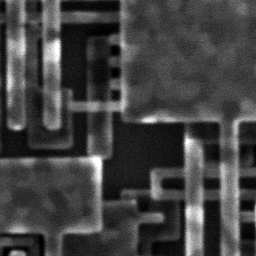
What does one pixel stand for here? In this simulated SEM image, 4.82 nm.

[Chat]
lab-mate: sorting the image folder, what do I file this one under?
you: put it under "wiring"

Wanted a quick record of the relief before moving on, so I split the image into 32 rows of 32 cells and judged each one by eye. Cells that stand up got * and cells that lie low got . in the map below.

.**..**........*****************
.**..**........*****************
.**..**........*****************
.**..**........*****************
.**..**........*****************
.**..**........*****************
.**..**........*****************
.**..**........*****************
.**..**........*****************
.**..**........*****************
.**..**........*****************
.**..**........*****************
.**..**........*****************
.**..**........*****************
.**..**........*****************
.**..**....................***..
............................**..
.......................**...**..
.......................**...**..
.......................**...**..
*************..........**...**..
*************..........**...**..
*************..........**...**..
*************..........**...**..
*************..........**...**..
*************..........**...**..
*************..........**...**..
*************..........**...**..
*************..........**...**..
.....***...............**...**..
......**...............**...**..
..*...**...............**...**..